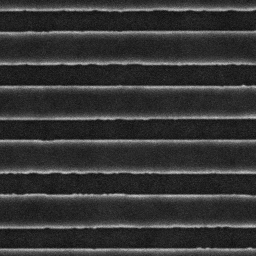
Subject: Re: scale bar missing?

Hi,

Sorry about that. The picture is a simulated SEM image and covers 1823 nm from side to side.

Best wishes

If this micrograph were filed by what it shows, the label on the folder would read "lines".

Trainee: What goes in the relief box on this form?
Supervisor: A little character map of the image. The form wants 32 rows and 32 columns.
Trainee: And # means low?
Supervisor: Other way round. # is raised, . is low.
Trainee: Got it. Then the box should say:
################################
................................
................................
................................
################################
################################
################################
################################
................................
................................
................................
################################
################################
################################
################################
................................
................................
................................
################################
################################
################################
################################
................................
................................
###############################.
################################
################################
################################
................................
................................
................................
################################